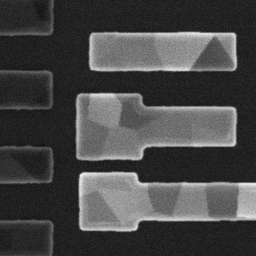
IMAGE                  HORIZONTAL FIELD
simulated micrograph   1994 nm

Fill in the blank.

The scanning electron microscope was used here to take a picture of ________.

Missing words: wiring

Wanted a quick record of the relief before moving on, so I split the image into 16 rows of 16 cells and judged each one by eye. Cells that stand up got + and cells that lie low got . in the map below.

+++.............
+++.............
......+++++++++.
......+++++++++.
................
+++.............
+++..++++.......
.....++++++++++.
.....++++++++++.
+++..++++.......
+++.............
.....++++.......
.....+++++++++++
.....+++++++++++
+++.............
+++.............